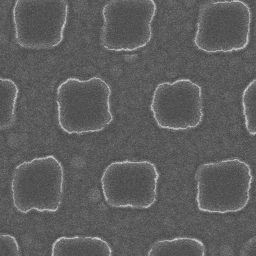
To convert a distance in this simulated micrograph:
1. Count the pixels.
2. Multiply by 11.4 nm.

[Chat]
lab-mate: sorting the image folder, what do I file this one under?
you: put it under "raised bodies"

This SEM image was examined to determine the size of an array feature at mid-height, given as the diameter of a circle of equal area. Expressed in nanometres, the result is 641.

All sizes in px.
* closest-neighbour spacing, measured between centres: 92